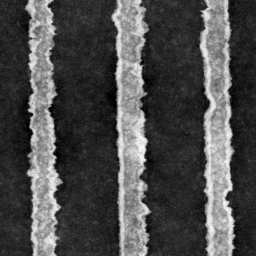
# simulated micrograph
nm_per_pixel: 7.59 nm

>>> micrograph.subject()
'one or a few lines or trenches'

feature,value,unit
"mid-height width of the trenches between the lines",508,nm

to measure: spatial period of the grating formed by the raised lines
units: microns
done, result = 0.666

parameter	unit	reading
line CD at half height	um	0.15